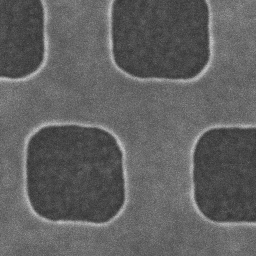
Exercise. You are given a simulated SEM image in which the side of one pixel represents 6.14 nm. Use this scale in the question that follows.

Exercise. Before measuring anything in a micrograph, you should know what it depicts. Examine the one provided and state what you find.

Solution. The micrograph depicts holes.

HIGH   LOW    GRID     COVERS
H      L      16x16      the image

LLLHHHHLLLLLLHHH
LLLHHHHLLLLLLHHH
LLLHHHHLLLLLLHHH
LLLHHHHLLLLLLHHH
LLHHHHHHLLLLLHHH
HHHHHHHHHHHHHHHH
HHHHHHHHHHHHHHHH
HHHHHHHHHHHHHHHH
HHLLLLLHHHHHHLLL
HHLLLLLLHHHHLLLL
HHLLLLLLHHHHLLLL
HHLLLLLLHHHHLLLL
HHLLLLLLHHHHLLLL
HHHLLLLHHHHHHLLL
HHHHHHHHHHHHHHHH
HHHHHHHHHHHHHHHH